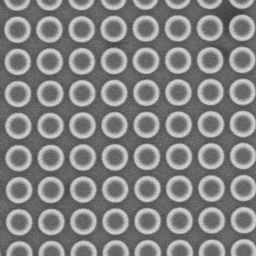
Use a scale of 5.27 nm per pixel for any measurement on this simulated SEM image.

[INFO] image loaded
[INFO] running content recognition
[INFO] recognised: an array of small figures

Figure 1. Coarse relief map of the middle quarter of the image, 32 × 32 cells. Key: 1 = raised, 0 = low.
01111110001111100011111000111110
00111110001111100011111000111110
00000000000000000000000000000000
00000000000000000000000000000000
00011100000111000001110000011100
00111110001111100011111000111110
01111111011111110011111101111111
01111111011111110011111101111111
01111111001111110011111000111110
00111110001111100011111000111110
00000000000000000000000000000000
00000000000000000000000000000000
00011100000111000001110000011100
00111110001111100011111000111110
00111111001111110011111100111111
01111111001111110011111100111111
00111111001111110011111000111111
00111110001111100011111000111110
00000000000000000000000000000000
00000000000000000000000000000000
00011100000111000001110000011100
00111110001111100011111000111110
00111111001111110011111100111111
01111111001111110011111100111111
00111111001111110011111100111111
00111110001111100011111000011110
00000000000010000000000000000000
00000000000000000000000000000000
00011100000111000001110000011110
00111110001111100011111100111110
00111111001111110011111100111111
00111111001111110011111100111111